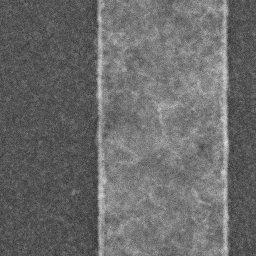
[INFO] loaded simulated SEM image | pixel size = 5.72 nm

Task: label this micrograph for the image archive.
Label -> one or a few lines or trenches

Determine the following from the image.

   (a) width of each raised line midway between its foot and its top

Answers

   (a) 126 pixels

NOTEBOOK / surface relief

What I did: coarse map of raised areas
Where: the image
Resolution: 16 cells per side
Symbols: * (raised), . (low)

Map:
......********..
......********..
......********..
......********..
......********..
......********..
......********..
......********..
......********..
......********..
......********..
......********..
......********..
......********..
......********..
......********..